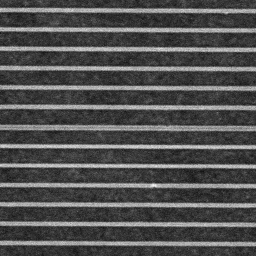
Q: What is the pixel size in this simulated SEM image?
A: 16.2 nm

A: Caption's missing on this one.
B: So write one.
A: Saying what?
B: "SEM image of parallel lines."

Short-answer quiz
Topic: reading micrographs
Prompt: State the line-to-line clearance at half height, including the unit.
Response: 15.6 px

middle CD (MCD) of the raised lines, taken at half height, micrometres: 0.0608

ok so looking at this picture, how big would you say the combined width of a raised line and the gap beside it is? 315 nm